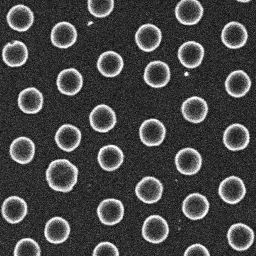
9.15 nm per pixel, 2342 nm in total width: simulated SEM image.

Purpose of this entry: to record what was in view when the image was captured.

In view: a regular array of raised bodies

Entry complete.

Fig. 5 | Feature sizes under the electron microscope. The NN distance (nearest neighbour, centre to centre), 398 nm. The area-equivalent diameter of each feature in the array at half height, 24.9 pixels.